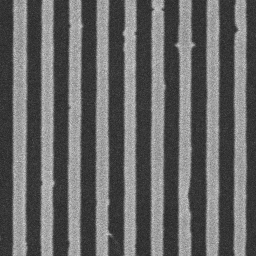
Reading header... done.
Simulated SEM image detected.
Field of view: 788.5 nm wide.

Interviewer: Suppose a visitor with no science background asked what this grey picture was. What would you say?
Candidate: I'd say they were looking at parallel lines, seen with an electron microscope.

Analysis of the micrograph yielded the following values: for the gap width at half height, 48.5 nm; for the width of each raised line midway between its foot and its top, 36.6 nanometers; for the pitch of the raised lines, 0.085 microns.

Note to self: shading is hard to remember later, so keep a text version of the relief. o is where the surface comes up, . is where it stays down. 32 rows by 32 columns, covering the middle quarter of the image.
.ooo....ooo....ooo....ooo....ooo
.ooo....ooo....ooo....ooo....ooo
.ooo....ooo....ooo....ooo....ooo
.ooo....ooo....ooo....ooo....ooo
.ooo....ooo....ooo....ooo....ooo
.ooo....ooo....ooo....ooo....ooo
.ooo....ooo....ooo....ooo....ooo
.ooo....ooo....ooo....ooo....ooo
.ooo....ooo....ooo....ooo....ooo
.ooo....ooo....ooo....ooo....ooo
.ooo....ooo....ooo....ooo....ooo
.ooo....ooo....ooo....ooo....ooo
.ooo....ooo....ooo....ooo....oo.
.ooo....ooo....ooo....ooo....oo.
.ooo....ooo....ooo....ooo....oo.
.ooo....ooo....ooo....ooo....oo.
.ooo....ooo....ooo....ooo....ooo
.ooo....ooo....ooo....ooo....ooo
.ooo....ooo....ooo....ooo....ooo
.ooo....ooo....ooo....ooo....ooo
.ooo....ooo....ooo....ooo....ooo
.ooo....ooo....ooo....ooo....ooo
.ooo....ooo....ooo....ooo....ooo
.ooo....ooo....ooo....ooo....ooo
.ooo....ooo....ooo....ooo....ooo
.ooo....ooo....ooo....ooo....ooo
.ooo....ooo....ooo....ooo....ooo
.ooo....ooo....ooo....ooo....ooo
.ooo....ooo....ooo....ooo....ooo
.ooo....ooo....ooo....ooo....oo.
.ooo....ooo....ooo....ooo....oo.
.ooo....ooo....ooo....ooo....oo.